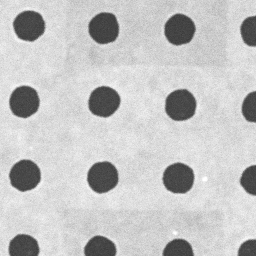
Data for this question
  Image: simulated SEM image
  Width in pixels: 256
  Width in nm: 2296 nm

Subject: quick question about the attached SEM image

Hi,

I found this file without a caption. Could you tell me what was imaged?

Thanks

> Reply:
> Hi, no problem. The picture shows a regular array of holes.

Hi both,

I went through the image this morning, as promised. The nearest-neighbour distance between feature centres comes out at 661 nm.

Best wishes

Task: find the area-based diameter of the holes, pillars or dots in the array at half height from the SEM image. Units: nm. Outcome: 288